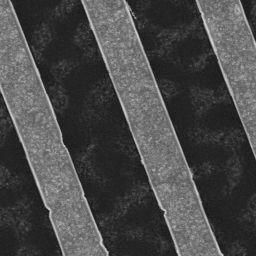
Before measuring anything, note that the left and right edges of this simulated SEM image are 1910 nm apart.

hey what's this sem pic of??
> one or a few lines or trenches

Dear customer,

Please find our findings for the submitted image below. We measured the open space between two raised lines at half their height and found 499 nanometres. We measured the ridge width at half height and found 292 nanometers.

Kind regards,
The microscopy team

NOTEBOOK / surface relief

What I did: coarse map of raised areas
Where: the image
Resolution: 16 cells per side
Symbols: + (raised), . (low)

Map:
+....+++....+++.
+.....++.....++.
++....+++....+++
++....+++.....++
++.....++.....++
+++....+++....++
+++.....++.....+
.+++....+++....+
.+++....+++....+
..++.....++.....
..+++....+++....
..+++....+++....
...++.....++....
...+++....+++...
...+++.....++...
....+++....+++..